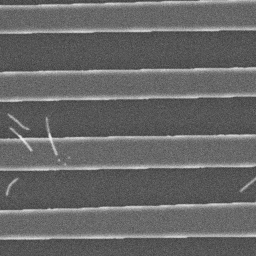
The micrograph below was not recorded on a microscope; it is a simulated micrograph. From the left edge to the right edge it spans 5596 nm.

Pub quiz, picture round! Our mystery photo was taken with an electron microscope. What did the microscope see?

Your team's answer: lines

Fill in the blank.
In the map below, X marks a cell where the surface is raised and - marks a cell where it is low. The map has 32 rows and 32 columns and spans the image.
-------------XXXXXXXXXXXXXXXXXXX
XXXXXXXXXXXXXXXXXXXXXXXXXXXXXXXX
XXXXXXXXXXXXXXXXXXXXXXXXXXXXXXXX
XXXXXXXXXXXXXXXXXXXXXXXXXXXXXXXX
--------------------------------
--------------------------------
--------------------------------
--------------------------------
-----------------------------X-X
XXXXXXXXXXXXXXXXXXXXXXXXXXXXXXXX
XXXXXXXXXXXXXXXXXXXXXXXXXXXXXXXX
XXXXXXXXXXXXXXXXXXXXXXXXXXXXXXXX
XXXXXXX-------------------------
--------------------------------
--------------------------------
--------------------------------
--------------------------------
XXXXXXXXXXXXXXXXXXXXXXXXXXXXXXXX
XXXXXXXXXXXXXXXXXXXXXXXXXXXXXXXX
XXXXXXXXXXXXXXXXXXXXXXXXXXXXXXXX
XXXXXXXXXXXXXXXXXXXXXXXXXXXXXXXX
--------------------------------
--------------------------------
--------------------------------
--------------------------------
-----------------------------XXX
XXXXXXXXXXXXXXXXXXXXXXXXXXXXXXXX
XXXXXXXXXXXXXXXXXXXXXXXXXXXXXXXX
XXXXXXXXXXXXXXXXXXXXXXXXXXXXXXXX
XXXXXXXXXXXXXXXXXXXXXXXXXXXXXXXX
--------------------------------
--------------------------------